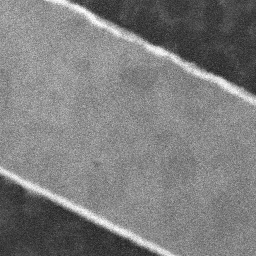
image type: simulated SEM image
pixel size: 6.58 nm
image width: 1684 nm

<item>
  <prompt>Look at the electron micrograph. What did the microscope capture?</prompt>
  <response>one or a few lines or trenches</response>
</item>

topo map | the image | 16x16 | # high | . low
#####...........
######..........
########........
###########.....
############....
##############..
################
################
################
################
################
..##############
....############
......##########
........########
..........######